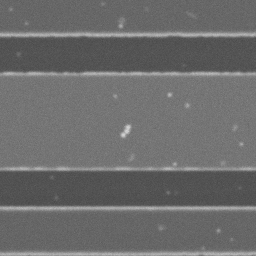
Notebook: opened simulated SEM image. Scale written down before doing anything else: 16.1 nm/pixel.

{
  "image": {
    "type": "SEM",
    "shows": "lines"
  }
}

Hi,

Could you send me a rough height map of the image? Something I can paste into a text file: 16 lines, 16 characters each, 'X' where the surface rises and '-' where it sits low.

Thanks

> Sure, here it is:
XXXXXXXXXXXXXXXX
XXXXXXXXXXXXXXXX
----------------
----------------
----------------
XXXXXXXXXXXXXXXX
XXXXXXXXXXXXXXXX
XXXXXXXXXXXXXXXX
XXXXXXXXXXXXXXXX
XXXXXXXXXXXXXXXX
XXXXXXXXXXXXXXXX
----------------
----------------
XXXXXXXXXXXXXXXX
XXXXXXXXXXXXXXXX
XXXXXXXXXXXXXXXX